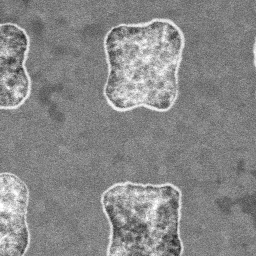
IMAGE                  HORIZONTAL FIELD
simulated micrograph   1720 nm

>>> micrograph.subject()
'holes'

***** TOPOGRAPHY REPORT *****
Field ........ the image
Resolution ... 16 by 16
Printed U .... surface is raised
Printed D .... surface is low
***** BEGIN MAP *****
UUUUUUUUUUUUUUUU
UUUUUUUUUDDUUUUU
DDUUUUUDDDDUUUUU
DDUUUUUDDDDUUUUU
DDUUUUUDDDDUUUUU
DDUUUUUDDDDUUUUU
DUUUUUUDDDDUUUUU
UUUUUUUUUUUUUUUU
UUUUUUUUUUUUUUUU
UUUUUUUUUUUUUUUU
UUUUUUUUUUUUUUUU
DUUUUUUUUUUUUUUU
DDUUUUDDDDDUUUUU
DDUUUUUDDDDUUUUU
DDUUUUUDDDDUUUUU
DDUUUUUDDDDUUUUU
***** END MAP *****